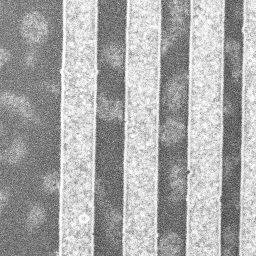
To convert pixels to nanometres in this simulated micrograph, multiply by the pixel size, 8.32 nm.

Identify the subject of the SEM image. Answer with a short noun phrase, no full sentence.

parallel lines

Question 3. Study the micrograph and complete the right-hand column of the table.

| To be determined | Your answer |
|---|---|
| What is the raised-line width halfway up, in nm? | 274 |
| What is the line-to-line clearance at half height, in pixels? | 30.4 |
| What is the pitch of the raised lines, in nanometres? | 528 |